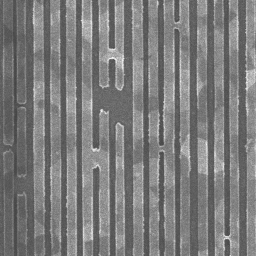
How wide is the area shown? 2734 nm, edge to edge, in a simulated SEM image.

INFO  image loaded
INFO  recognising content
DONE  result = parallel lines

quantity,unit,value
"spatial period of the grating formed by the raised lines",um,0.172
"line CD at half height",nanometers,97.5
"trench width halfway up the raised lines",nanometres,73.4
